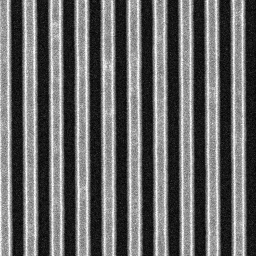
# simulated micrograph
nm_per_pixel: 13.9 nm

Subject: parallel lines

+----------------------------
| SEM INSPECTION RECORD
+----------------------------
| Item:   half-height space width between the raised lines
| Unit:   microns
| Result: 0.206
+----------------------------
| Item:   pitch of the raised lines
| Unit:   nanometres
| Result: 363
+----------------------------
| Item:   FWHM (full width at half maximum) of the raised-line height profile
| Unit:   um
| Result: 0.157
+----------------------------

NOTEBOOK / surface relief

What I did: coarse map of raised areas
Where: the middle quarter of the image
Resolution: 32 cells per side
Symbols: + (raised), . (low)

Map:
...+++....++....+++....++....+++
...+++....++....+++....++....+++
...+++....++....+++....++....+++
...+++....++....+++....++....+++
...+++....++....+++....++....+++
...+++....++....+++....++....+++
...+++....++....+++....++....+++
...+++....++....+++....++....+++
...+++....++....+++....++....+++
...+++....++....+++....++....+++
...+++....++....+++....++....+++
...+++....++....+++....++....+++
...+++....++....+++....++....+++
...+++....++....+++....++....+++
...+++....++....+++....++....+++
...+++....++....+++....++....+++
...+++....++....+++....++....+++
...+++....++....+++....++....+++
...+++....++....+++....++....+++
...+++....+++...+++....++....+++
...+++....+++...+++....++....+++
...+++....++....+++....++....+++
...+++....++....+++....++....+++
...+++....+++...+++....++....+++
...+++....+++...+++....++....+++
...+++....+++...+++....+++...+++
...+++....+++...+++....+++...+++
...+++....+++...+++....+++...+++
...+++....+++...+++....+++...+++
...+++....+++...+++....+++...+++
....++....++....+++....+++...+++
....++....++....+++....+++...+++